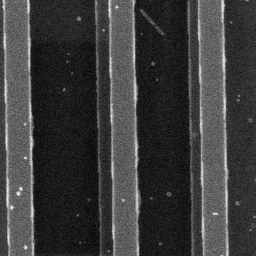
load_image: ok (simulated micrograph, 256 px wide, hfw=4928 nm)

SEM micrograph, lines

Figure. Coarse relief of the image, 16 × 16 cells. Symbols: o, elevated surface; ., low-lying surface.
oo....oo....oo..
oo....oo....oo..
oo....oo....oo..
oo....oo....oo..
oo....oo....oo..
oo....ooo...oo..
oo....ooo...oo..
oo....oo....oo..
oo....ooo...oo..
oo....ooo...oo..
oo....ooo...oo..
oo....ooo...oo..
oo....ooo...oo..
oo....ooo...oo..
oo....ooo...oo..
oo....ooo...oo..